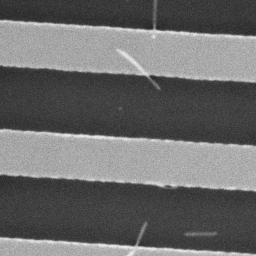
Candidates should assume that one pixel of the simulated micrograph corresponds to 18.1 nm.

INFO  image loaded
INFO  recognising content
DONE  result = lines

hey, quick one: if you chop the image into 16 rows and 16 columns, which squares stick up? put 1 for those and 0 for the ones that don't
0000000000000000
1111000000000000
1111111111111111
1111111111111111
0000001111111111
0000000000000000
0000000000000000
0000000000000000
1111110000000000
1111111111111111
1111111111111111
0000000001111111
0000000000000000
0000000000000000
0000000000000000
1111111110000000